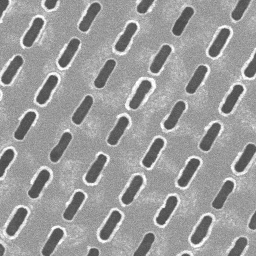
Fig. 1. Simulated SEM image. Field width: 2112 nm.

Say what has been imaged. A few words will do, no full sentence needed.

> a regular array of holes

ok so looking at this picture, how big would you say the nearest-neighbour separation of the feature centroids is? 338 nm